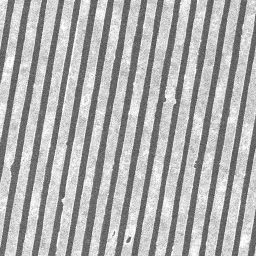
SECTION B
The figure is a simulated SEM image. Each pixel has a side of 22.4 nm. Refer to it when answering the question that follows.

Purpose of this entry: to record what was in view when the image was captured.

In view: parallel lines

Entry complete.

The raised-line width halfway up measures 0.218 microns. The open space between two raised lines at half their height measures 152 nanometers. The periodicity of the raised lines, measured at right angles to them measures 368 nanometres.